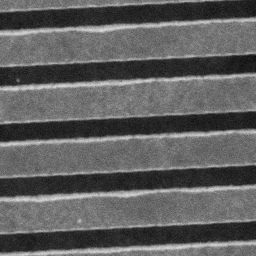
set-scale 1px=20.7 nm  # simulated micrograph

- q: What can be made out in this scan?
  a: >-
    lines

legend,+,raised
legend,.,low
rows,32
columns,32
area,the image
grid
++++++++++++++++++..............
................................
.............................+++
.............+++++++++++++++++++
++++++++++++++++++++++++++++++++
++++++++++++++++++++++++++++++++
++++++++++++++++++++++++++++++++
++++++++++++++++................
................................
.............................+++
...........+++++++++++++++++++++
++++++++++++++++++++++++++++++++
++++++++++++++++++++++++++++++++
++++++++++++++++++++++++++++++++
++++++++++++++++++..............
................................
............................++++
..........++++++++++++++++++++++
++++++++++++++++++++++++++++++++
++++++++++++++++++++++++++++++++
++++++++++++++++++++++++++++++++
++++++++++++++..................
................................
...........................+++++
.........+++++++++++++++++++++++
++++++++++++++++++++++++++++++++
++++++++++++++++++++++++++++++++
++++++++++++++++++++++++++++++++
++++++++++++++..................
................................
...........................+++++
.......+++++++++++++++++++++++++